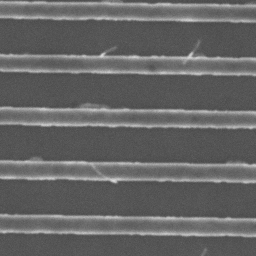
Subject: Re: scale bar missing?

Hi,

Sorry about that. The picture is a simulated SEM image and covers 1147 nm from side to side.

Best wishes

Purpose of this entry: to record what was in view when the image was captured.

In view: lines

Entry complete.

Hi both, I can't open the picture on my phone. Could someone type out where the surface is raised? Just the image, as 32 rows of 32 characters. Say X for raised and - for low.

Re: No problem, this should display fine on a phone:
XXXXXXXXXXXXXXXXXXXXX-----------
XXXXXXXXXXXXXXXXXXXXXXXXXXXXXXXX
--------------X-XXXXXXXXXXXXXXXX
--------------------------------
--------------------------------
--------------------------------
--------------------------------
XXXXXXXXXXXXXXXXXXXXXXXXXXXXXXXX
XXXXXXXXXXXXXXXXXXXXXXXXXXXXXXXX
--------------------------------
--------------------------------
--------------------------------
--------------------------------
XX------------------------------
XXXXXXXXXXXXXXXXXXXXXXXXXXXXXXXX
--XXXXXXXXXXXXXXXXXXXXXXXXXXXXXX
--------------------------------
--------------------------------
--------------------------------
--------------------------------
XXXXXXXXXXXXXXXXXXXXXXXX-----X--
XXXXXXXXXXXXXXXXXXXXXXXXXXXXXXXX
----------XXXXXXXXXXXXXXXXXXXXXX
--------------------------------
--------------------------------
--------------------------------
--------------------------------
XXXXXXXXXXXXXXXXXXXXXXXXXXXXXXXX
XXXXXXXXXXXXXXXXXXXXXXXXXXXXXXXX
------------------------------XX
--------------------------------
--------------------------------